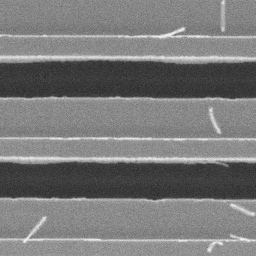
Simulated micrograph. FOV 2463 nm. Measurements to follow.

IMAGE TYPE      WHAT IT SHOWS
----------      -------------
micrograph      lines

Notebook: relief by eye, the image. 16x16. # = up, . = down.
################
################
################
################
................
................
################
################
################
################
................
................
#########.####..
################
################
################